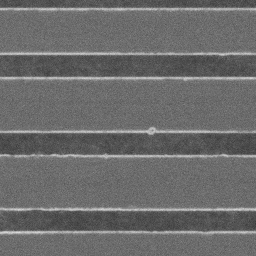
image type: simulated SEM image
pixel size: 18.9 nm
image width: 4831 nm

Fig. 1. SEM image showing lines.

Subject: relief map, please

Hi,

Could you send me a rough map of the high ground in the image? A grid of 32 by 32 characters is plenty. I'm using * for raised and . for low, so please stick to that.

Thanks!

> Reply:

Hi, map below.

................................
********************************
********************************
********************************
********************************
********************************
********************************
................................
................................
................................
********************************
********************************
********************************
********************************
********************************
********************************
..................**............
................................
................................
********************************
********************************
********************************
********************************
********************************
********************************
********************************
................................
................................
................................
********************************
********************************
********************************